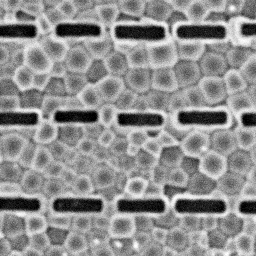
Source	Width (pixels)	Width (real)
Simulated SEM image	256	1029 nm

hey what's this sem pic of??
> a regular array of holes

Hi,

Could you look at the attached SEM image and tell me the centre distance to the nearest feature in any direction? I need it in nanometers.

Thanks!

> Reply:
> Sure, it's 186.